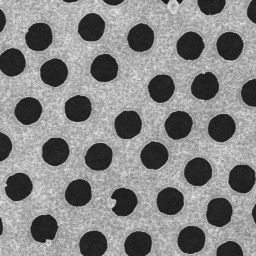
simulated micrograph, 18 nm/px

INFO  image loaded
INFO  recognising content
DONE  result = a regular array of holes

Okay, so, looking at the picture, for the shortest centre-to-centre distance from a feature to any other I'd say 746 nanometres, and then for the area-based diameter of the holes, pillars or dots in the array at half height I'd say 504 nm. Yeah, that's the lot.